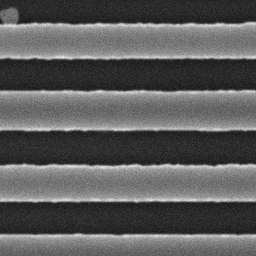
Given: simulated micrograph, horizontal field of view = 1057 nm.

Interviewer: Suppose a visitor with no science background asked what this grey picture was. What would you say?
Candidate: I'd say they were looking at lines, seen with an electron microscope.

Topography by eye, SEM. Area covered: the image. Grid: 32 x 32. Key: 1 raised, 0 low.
00000000000000000000000000000000
00000000000000000000000000000000
00000000000000000000000000000000
11111111111111111111111111111111
11111111111111111111111111111111
11111111111111111111111111111111
11111111111111111111111111111111
00000000000000000000000000000000
00000000000000000000000000000000
00000000000000000000000000000000
00000000000000000000000000000000
11111111111111111111101111111111
11111111111111111111111111111111
11111111111111111111111111111111
11111111111111111111111111111111
11111111111111111111111111111111
00000000000000000000000000000000
00000000000000000000000000000000
00000000000000000000000000000000
00000000000000000000000000000000
00000000000000000000000000000000
11111111111111111111111111111111
11111111111111111111111111111111
11111111111111111111111111111111
11111111111111111111111111111111
00000000000000000000000000000000
00000000000000000000000000000000
00000000000000000000000000000000
00000000000000000000000000000000
11111111111111111111111111111111
11111111111111111111111111111111
11111111111111111111111111111111